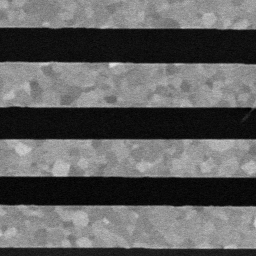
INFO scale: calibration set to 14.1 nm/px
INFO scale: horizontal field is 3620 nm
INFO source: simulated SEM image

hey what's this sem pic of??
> lines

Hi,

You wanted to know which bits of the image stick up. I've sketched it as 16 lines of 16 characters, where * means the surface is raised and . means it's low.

****************
****************
................
................
****************
****************
****************
................
................
****************
****************
................
................
****************
****************
................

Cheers